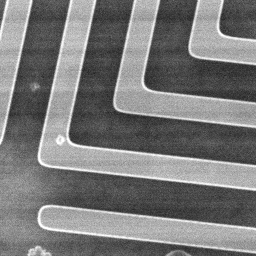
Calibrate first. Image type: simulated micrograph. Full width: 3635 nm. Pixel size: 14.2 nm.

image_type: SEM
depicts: groups of lines, slits or small figures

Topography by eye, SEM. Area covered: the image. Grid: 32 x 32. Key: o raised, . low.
.ooo.....ooo.....ooo.....ooo....
.ooo.....ooo.....ooo.....ooo....
oooo....ooo.....ooo.....ooo.....
ooo.....ooo.....ooo.....ooo.....
ooo.....ooo.....ooo.....oooo....
ooo.....ooo.....ooo.....oooooooo
ooo....oooo....oooo.....oooooooo
oo.....ooo.....ooo.........ooooo
oo.....ooo.....ooo..............
oo.....ooo.....ooo..............
oo.....ooo.....ooo..............
oo....oooo....oooooo............
o.....ooo.....ooooooooooooooo...
o.....ooo......ooooooooooooooooo
o.....ooo...........oooooooooooo
o.....ooo...................oooo
o....oooo.......................
.....oooo.......................
.....oooooooo...................
.....oooooooooooooooo...........
.....ooooooooooooooooooooooooo..
............oooooooooooooooooooo
.....................ooooooooooo
..............................oo
................................
................................
.....ooooooooo..................
.....ooooooooooooooooo..........
......ooooooooooooooooooooooooo.
..............oooooooooooooooooo
......................oooooooooo
...............................o